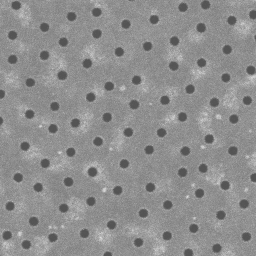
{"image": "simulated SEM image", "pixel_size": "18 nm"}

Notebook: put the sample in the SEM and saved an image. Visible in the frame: a regular array of holes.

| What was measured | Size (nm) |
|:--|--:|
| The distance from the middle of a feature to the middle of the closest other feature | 464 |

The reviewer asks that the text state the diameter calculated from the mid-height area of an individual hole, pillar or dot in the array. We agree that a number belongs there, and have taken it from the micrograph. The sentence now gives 181 nm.